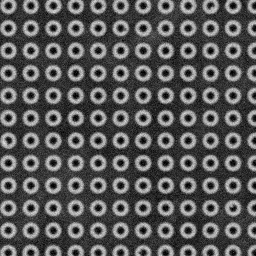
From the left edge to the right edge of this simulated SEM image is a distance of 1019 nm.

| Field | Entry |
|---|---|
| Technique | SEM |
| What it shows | an array of small figures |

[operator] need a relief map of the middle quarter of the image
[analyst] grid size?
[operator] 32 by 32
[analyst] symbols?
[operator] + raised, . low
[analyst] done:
..++....+....++....++....+....++
.++++..+++..++++..++++..+++..+++
.++++..+++..++++..++++..+++..+++
.++++..+++...+++..+++...+++..+++
................................
................................
..++...+++...+++...++...+++...++
.++++..+++..++++..++++..+++..+++
.++++..+++..++++..++++..+++..+++
..++...+++...++....++...+++...++
................................
................................
.++++..+++..++++..+++...+++..+++
.++++..+++..++++..++++..+++..+++
.++++..+++..++++..+++...+++..+++
................................
................................
..++...+++...++....++...++....++
.++++..+++..++++..++++..+++..+++
.++++..+++..++++..++++..+++..+++
..++...+++...+++..+++...+++...++
................................
................................
..++...+++...+++..+++...+++...++
.++++..+++..++++..++++..+++..+++
.++++..+++..++++..++++..+++..+++
..++....++...++....++...++....++
................................
................................
.++++..+++..++++..+++...+++..+++
.++++..+++..++++..++++..+++..+++
.++++..+++...+++..+++...+++..+++